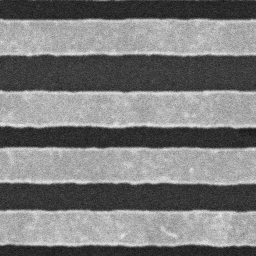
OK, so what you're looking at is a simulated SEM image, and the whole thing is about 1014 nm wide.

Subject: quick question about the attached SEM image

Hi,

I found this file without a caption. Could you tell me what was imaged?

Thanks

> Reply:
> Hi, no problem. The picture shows lines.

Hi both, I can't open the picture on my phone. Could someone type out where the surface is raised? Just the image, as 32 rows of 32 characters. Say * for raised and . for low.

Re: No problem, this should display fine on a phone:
................................
................................
*.........***..***********.....*
********************************
********************************
********************************
********************************
................................
................................
................................
................................
*...**...................*****..
********************************
********************************
********************************
********************************
................................
................................
................................
********************************
********************************
********************************
********************************
................................
................................
................................
******************************.*
********************************
********************************
********************************
*.*********************.********
................................